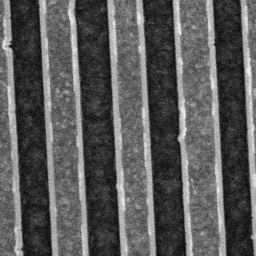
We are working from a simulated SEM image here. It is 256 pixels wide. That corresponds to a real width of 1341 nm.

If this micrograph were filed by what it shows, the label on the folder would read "one or a few lines or trenches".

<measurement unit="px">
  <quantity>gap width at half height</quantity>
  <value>34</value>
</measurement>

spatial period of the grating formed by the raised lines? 355 nm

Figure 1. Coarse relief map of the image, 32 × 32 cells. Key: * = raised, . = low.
*....****.....****....****....**
*....****.....****....****....**
*....****.....****....****....**
*....****.....****....*****....*
*....****.....****....*****....*
*....****.....****....*****....*
*.....****....****....*****....*
*.....****....****....*****....*
*.....****....****....*****....*
*.....****....****....*****....*
*.....****....****....*****....*
*.....****....****....*****....*
**....****....****.....****....*
**....****....****.....****....*
**....****.....***.....****....*
**....****.....***.....****....*
**....****.....***.....****....*
**....****.....***.....****....*
**....****.....***.....****....*
**....****.....****....****....*
**....****.....****....****....*
**....****.....****....****....*
**....****.....****....*****....
**....****.....****....*****....
**....****.....****....*****....
**.....***.....****....*****....
**.....****....****....*****....
**.....****....****....*****....
**.....****....****....*****....
**.....****....****....*****....
**.....****....****.....****....
***....****....****.....****....